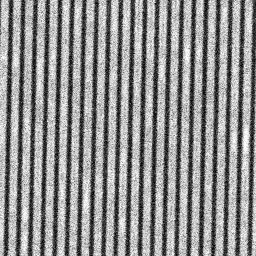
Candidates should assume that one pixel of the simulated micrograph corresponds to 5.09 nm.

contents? parallel lines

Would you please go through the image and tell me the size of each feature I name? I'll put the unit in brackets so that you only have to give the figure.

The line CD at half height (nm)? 35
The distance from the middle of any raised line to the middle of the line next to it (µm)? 0.062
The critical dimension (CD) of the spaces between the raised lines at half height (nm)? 26.1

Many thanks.